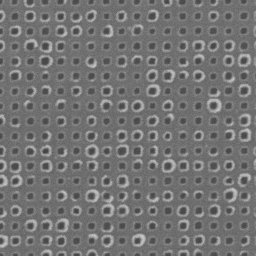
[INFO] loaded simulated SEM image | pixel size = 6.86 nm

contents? a regular array of holes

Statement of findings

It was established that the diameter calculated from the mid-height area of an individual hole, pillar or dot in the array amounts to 48.6 nanometers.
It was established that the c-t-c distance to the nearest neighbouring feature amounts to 101 nm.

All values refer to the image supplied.